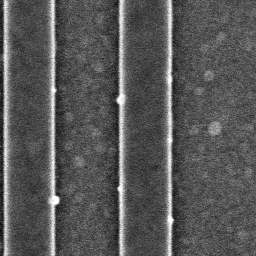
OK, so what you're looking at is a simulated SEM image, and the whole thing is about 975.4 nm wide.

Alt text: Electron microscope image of one or a few lines or trenches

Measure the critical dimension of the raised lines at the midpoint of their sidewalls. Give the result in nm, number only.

191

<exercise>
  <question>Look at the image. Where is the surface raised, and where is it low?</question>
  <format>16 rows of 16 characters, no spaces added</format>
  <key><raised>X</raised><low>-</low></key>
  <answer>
XXX-----XXX-----
XXX----XXXX-----
XXX----XXXX-----
XXX----XXXX-----
XXX-----XXX-----
XXX----XXXX-----
XXX----XXXX-----
XXX-----XXX-----
XXX-----XXX-----
XXX----XXXX-----
XXX----XXXX-----
XXX----XXXX-----
XXXX----XXX-----
XXX-----XXX-----
XXX-----XXX-----
XXX----XXXX-----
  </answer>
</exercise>